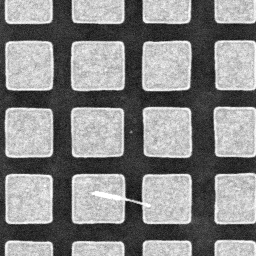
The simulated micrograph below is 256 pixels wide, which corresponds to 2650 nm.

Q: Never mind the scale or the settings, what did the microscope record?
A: wiring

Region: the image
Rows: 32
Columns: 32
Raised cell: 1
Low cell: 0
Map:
01111100011111100011111100011111
01111100011111100011111100011111
01111100011111100011111100011111
00000000000000000000000000000000
00000000000000000000000000000000
01111100011111100011111100011111
01111110011111110011111100011111
01111110011111110011111100011111
01111110011111110011111100011111
01111110011111110011111100011111
01111110011111110011111100011111
00000000000000000000000000000000
00000000000000000000000000000000
00000000000000000000000000011000
01111110011111100011111100011111
01111110011111100011111100011111
01111110011111100011111100011111
01111110011111100011111100011111
01111110011111100011111100011111
01111100011111100001111100011111
00000000000000000000000000000000
00000000000000000000000000000000
01111100011111110011111100011111
01111100011111110011111100011111
01111100011111110011111100011111
01111100011111110011111100011111
01111100011111110011111100011111
01111100011111100011111100011111
00000000000000000000000000000000
00000000000000000000000000000000
01111100011111100011111100011111
01111110011111100011111100011111